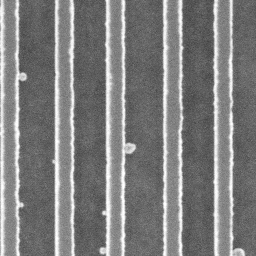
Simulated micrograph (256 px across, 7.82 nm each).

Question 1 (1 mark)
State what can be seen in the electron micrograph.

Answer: lines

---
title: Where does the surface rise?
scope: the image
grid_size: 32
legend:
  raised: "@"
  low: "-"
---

@@-----@@----@@@-----@@----@@---
@@-----@@----@@@-----@@----@@---
@@-----@@----@@@-----@@----@@---
@@-----@@----@@@-----@@----@@---
@@-----@@----@@@-----@@----@@---
@@-----@@----@@@-----@@----@@---
@@-----@@----@@@-----@@----@@---
@@-----@@----@@@-----@@----@@---
@@-----@@----@@@-----@@----@@---
@@-----@@----@@@-----@@----@@---
@@-----@@----@@@-----@@----@@---
@@-----@@----@@@-----@@----@@---
@@-----@@----@@@-----@@----@@---
@@-----@@----@@@-----@@----@@---
@@-----@@----@@@-----@@----@@---
@@-----@@----@@@-----@@----@@---
@@-----@@----@@@-----@@----@@---
@@-----@@----@@@-----@@----@@---
@@-----@@----@@@-----@@----@@---
@@-----@@----@@@-----@@----@@---
@@-----@@----@@@-----@@----@@---
@@-----@@----@@@-----@@----@@---
@@-----@@----@@@-----@@----@@---
@@-----@@----@@@-----@@----@@---
@@-----@@----@@------@@----@@---
@@-----@@----@@@-----@@----@@---
@@-----@@----@@------@@----@@---
@@-----@@----@@@-----@@----@@---
@@-----@@----@@------@@----@@---
@@-----@@----@@@-----@@----@@---
@@-----@@----@@@-----@@----@@---
@@-----@@----@@@-----@@----@@---